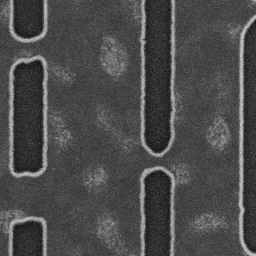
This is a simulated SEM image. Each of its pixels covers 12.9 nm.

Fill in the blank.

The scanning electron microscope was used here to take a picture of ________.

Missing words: one or a few lines or trenches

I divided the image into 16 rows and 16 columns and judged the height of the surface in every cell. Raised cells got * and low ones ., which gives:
*..******..*****
*..******..*****
*********..****.
*********..****.
*..******..****.
*..******..****.
*..******..****.
*..******..****.
*..******..****.
*..******.*****.
*..************.
*********..****.
*********..****.
*********..****.
*..******..****.
*..******..****.